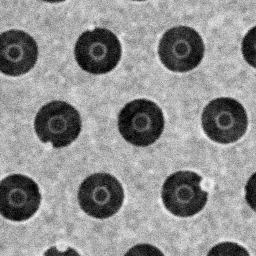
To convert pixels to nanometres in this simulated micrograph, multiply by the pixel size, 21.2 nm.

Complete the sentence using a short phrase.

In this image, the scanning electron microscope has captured an array of small figures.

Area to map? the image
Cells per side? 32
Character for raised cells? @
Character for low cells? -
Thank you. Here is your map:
@@@@@@@@@@@@@@@@@@@@@@@@@@@@@@@@
@@@@@@@@@@@@@@@@@@@@@@@@@@@@@@@@
@@@@@@@@@@@@@@@@@@@@@@@@@@@@@@@@
@@@@@@@@@@@@-@@@@@@@@---@@@@@@@-
----@@@@@@-----@@@@@-----@@@@@--
-----@@@@------@@@@@--@---@@@@--
-@@--@@@@--@@--@@@@@--@@--@@@@--
-----@@@@------@@@@@-----@@@@@--
----@@@@@@-----@@@@@@----@@@@@@-
@--@@@@@@@@@@@@@@@@@@@@@@@@@@@@@
@@@@@@@@@@@@@@@@@@@@@@@@@@@@@@@@
@@@@@@@@@@@@@@@@@@@@@@@@@@@@@@@@
@@@@@@@@@@@@@@@@---@@@@@@@----@@
@@@@@----@@@@@@-----@@@@@------@
@@@@------@@@@@--@---@@@@--@@--@
@@@@--@@--@@@@@--@@--@@@@--@@--@
@@@@------@@@@@-----@@@@@------@
@@@@@----@@@@@@@----@@@@@@----@@
@@@@@@@-@@@@@@@@@@@@@@@@@@@@@@@@
@@@@@@@@@@@@@@@@@@@@@@@@@@@@@@@@
@@@@@@@@@@@@@@@@@@@@@@@@@@@@@@@@
@@@@@@@@@@@@-@@@@@@@@@---@@@@@@@
----@@@@@@-----@@@@@@----@@@@@@-
-----@@@@@------@@@@---@-@@@@@@-
-@@--@@@@@--@---@@@@--@@--@@@@@-
--@--@@@@@------@@@@------@@@@@-
-----@@@@@-----@@@@@@----@@@@@@@
@---@@@@@@@@@@@@@@@@@@@@@@@@@@@@
@@@@@@@@@@@@@@@@@@@@@@@@@@@@@@@@
@@@@@@@@@@@@@@@@@@@@@@@@@@@@@@@@
@@@@@@@@@@@@@@@@@--@@@@@@@@---@@
@@@@@-----@@@@@@----@@@@@@-----@